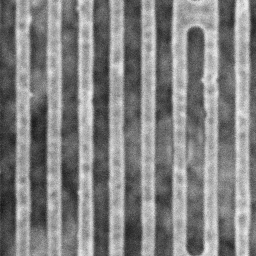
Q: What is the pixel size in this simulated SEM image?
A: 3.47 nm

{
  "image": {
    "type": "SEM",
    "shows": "parallel lines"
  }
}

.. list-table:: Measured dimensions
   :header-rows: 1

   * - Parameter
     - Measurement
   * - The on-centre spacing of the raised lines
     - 0.109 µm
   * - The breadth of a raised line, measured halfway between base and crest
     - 38.2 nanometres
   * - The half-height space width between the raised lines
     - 70.8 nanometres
